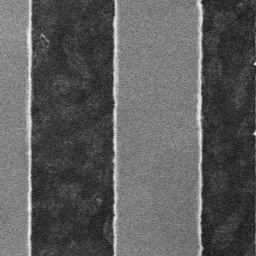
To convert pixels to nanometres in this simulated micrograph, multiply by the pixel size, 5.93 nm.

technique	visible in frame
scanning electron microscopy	one or a few lines or trenches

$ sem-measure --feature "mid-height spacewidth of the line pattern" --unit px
84.4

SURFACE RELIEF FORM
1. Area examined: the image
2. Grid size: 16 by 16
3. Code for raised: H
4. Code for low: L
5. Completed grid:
HHLLLLLHHHHHHLLL
HHLLLLLHHHHHHLLL
HHLLLLLHHHHHHLLL
HHLLLLLHHHHHHLLL
HHLLLLLHHHHHHLLL
HHLLLLLHHHHHHLLL
HHLLLLLHHHHHHLLL
HHLLLLLHHHHHHLLL
HHLLLLLHHHHHHLLL
HHLLLLLHHHHHHLLL
HHLLLLLHHHHHHLLL
HHLLLLLHHHHHHLLL
HHLLLLLHHHHHHLLL
HHLLLLLHHHHHHLLL
HHLLLLLHHHHHHLLL
HHLLLLLHHHHHHLLL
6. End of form